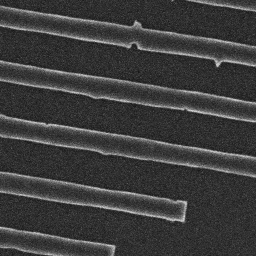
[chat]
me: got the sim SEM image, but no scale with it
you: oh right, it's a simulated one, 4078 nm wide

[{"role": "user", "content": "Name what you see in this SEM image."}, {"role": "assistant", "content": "parallel lines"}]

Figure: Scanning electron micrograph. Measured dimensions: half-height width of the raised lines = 19.4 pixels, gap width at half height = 0.556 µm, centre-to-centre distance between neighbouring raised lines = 871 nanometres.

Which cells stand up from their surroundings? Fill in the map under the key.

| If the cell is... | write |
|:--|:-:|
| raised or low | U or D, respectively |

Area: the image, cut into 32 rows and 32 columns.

DDDDDDDDDDDDDDDDDDDDDDDDDDUUUUUU
UUUUDDDDDDDDDDDDDDDDDDDDDDDDDDDD
UUUUUUUUUUUDDDDDDDDDDDDDDDDDDDDD
DDUUUUUUUUUUUUUUUUDDDDDDDDDDDDDD
DDDDDDDDUUUUUUUUUUUUUUUUDDDDDDDD
DDDDDDDDDDDDDDUUUUUUUUUUUUUUUUDD
DDDDDDDDDDDDDDDDDDDDUUUUUUUUUUUU
DDDDDDDDDDDDDDDDDDDDDDDDDDDUUUUU
UUUUUDDDDDDDDDDDDDDDDDDDDDDDDDDD
UUUUUUUUUUUDDDDDDDDDDDDDDDDDDDDD
DDUUUUUUUUUUUUUUUUDDDDDDDDDDDDDD
DDDDDDDDDUUUUUUUUUUUUUUUDDDDDDDD
DDDDDDDDDDDDDDUUUUUUUUUUUUUUUUDD
DDDDDDDDDDDDDDDDDDDDDUUUUUUUUUUU
UDDDDDDDDDDDDDDDDDDDDDDDDDDUUUUU
UUUUUDDDDDDDDDDDDDDDDDDDDDDDDDDD
UUUUUUUUUUUUDDDDDDDDDDDDDDDDDDDD
DDDUUUUUUUUUUUUUUUUDDDDDDDDDDDDD
DDDDDDDDDUUUUUUUUUUUUUUUUDDDDDDD
DDDDDDDDDDDDDDDDUUUUUUUUUUUUUUUD
DDDDDDDDDDDDDDDDDDDDDDUUUUUUUUUU
DDDDDDDDDDDDDDDDDDDDDDDDDDDDUUUU
UUUUUUUDDDDDDDDDDDDDDDDDDDDDDDDD
UUUUUUUUUUUUDDDDDDDDDDDDDDDDDDDD
DDDUUUUUUUUUUUUUUUDDDDDDDDDDDDDD
DDDDDDDDDUUUUUUUUUUUUUUDDDDDDDDD
DDDDDDDDDDDDDDDDUUUUUUUDDDDDDDDD
DDDDDDDDDDDDDDDDDDDDDUUDDDDDDDDD
UDDDDDDDDDDDDDDDDDDDDDDDDDDDDDDD
UUUUUUUDDDDDDDDDDDDDDDDDDDDDDDDD
UUUUUUUUUUUUUDDDDDDDDDDDDDDDDDDD
DDDDUUUUUUUUUUDDDDDDDDDDDDDDDDDD